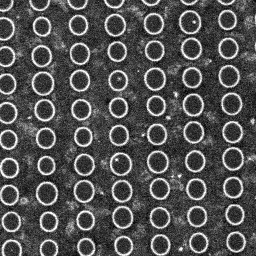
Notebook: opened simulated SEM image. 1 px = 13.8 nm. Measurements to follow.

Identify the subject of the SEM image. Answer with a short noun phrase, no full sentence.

a regular array of raised bodies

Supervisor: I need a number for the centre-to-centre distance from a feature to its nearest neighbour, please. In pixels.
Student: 27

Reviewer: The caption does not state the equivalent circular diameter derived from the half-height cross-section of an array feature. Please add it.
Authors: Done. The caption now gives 271 nm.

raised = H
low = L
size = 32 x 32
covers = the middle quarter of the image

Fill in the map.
LLLLLLLLLLLLLLLLLLLLLLLLLLLLLLLL
LLLLLLLLLLLLLLLLLLLLLHHHLLLLLLLH
LLHHHHLLLLLLHHHLLLLLLHHHHLLLLLHH
LLHHHHLLLLLHHHHHLLLLHHHHHLLLLLHH
LLHHHHLLLLLHHHHHLLLLHHHHHLLLLLHH
LLHHHHLLLLLLHHHLLLLLLHHHHLLLLLLH
LLLHHLLLLLLLLHLLLLLLLLLLLLLLLLLL
LLLLLLLLLLLLLLLLLLLLLLLLLLLLLLLL
LLLLLLLLLLLLLLLLLLLLLLHHLLLLLLLH
LLLHHHLLLLLLHHHLLLLLLHHHHLLLLLHH
LLHHHHLLLLLLHHHHLLLLLHHHHLLLLLHH
LLHHHHLLLLLLHHHHLLLLLHHHHLLLLLHH
LLHHHHLLLLLLHHHLLLLLLLHHLLLLLLLH
LLLHHHLLLLLLLLLLLLLLLLLLLLLLLLLL
LLLLLLLLLLLLLLLLLLLLLLLLLLLLLLLL
LLLLLLLLLLLLLLLLLLLLLLHHLLLLLLHH
LLLHHHLLLLLLHHHHLLLLLHHHHLLLLLHH
LLLHHHHLLLLLHHHHLLLLLHHHHLLLLLHH
LLLHHHHLLLLLHHHHLLLLLHHHHLLLLLLH
LLLHHHLLLLLLHHHLLLLLLLHHHLLLLLLL
LLLLLLLLLLLLLLLLLLLLLLLLLLLLLLLL
LLLLLLLLLLLLLLLLLLLLLLLLLLLLLLLL
LLLLLLLLLLLLLHHLLLLLLLHHHLLLLLLH
LLLHHHHLLLLLHHHHLLLLLHHHHHLLLLLH
LLLHHHHLLLLLHHHHHLLLLHHHHHLLLLLH
LLLHHHHLLLLLHHHHHLLLLHHHHHLLLLLH
LLLHHHHLLLLLHHHHLLLLLLHHHLLLLLLL
LLLLHHLLLLLLLHHLLLLLLLLLLLLLLLLL
LLLLLLLLLLLLLLLLLLLLLLLLLLLLLLLL
LLLLHHLLLLLLLLHHLLLLLLHHHLLLLLLL
LLLHHHHLLLLLHHHHLLLLLLHHHHLLLLLH
LLLHHHHLLLLLHHHHHLLLLLHHHHLLLLLH